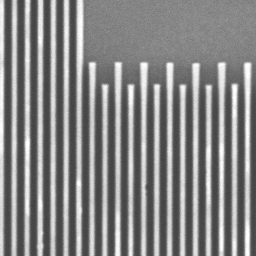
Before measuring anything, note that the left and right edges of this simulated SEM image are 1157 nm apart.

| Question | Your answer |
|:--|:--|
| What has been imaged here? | parallel lines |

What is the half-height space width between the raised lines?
35.6 nm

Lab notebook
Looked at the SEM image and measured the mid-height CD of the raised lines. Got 0.0226 micrometres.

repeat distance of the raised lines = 58.5 nm